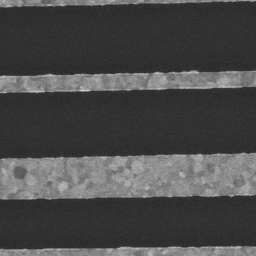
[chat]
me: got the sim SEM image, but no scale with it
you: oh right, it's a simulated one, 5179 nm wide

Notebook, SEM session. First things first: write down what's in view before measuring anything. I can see lines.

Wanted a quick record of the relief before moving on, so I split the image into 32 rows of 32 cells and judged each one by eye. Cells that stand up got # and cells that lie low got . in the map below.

#############...................
................................
................................
................................
................................
................................
................................
................................
................................
....############################
################################
#...............................
................................
................................
................................
................................
................................
................................
................................
...................#############
################################
################################
################################
################################
###################..#..........
................................
................................
................................
................................
................................
................................
################################